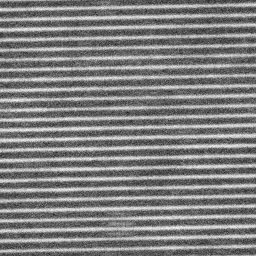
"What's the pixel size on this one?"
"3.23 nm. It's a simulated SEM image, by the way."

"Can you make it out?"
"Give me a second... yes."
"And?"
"parallel lines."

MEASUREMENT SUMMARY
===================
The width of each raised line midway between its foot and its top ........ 2.76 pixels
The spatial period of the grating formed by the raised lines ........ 32.5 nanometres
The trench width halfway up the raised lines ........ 23.8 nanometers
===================